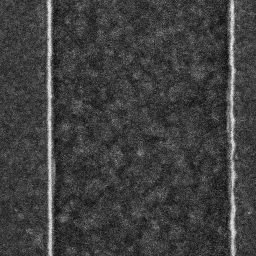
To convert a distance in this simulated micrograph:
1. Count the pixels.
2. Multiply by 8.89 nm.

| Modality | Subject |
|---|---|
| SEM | one or a few lines or trenches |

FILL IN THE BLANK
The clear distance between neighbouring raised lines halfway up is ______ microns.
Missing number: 1.63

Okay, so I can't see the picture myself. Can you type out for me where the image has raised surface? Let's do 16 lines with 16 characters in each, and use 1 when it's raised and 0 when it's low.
1110000000000001
1110000000000001
1110000000000011
1110000000000011
1110000000000001
1110000000000001
1110000000000011
1110000000000011
1110000000000011
1110000000000001
1110000000000001
1110000000000001
1110000000000001
1110000000000001
1110000000000001
1110000000000001